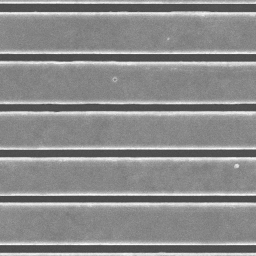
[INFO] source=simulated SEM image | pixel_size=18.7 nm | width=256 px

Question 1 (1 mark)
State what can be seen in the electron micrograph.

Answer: lines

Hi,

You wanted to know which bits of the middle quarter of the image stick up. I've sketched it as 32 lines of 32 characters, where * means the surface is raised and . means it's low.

********************************
********************************
********************************
********************************
********************************
********************************
********************************
********************************
********************************
********************************
................................
................................
********************************
********************************
********************************
********************************
********************************
********************************
********************************
********************************
********************************
................................
................................
********************************
********************************
********************************
********************************
********************************
********************************
********************************
********************************
********************************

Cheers